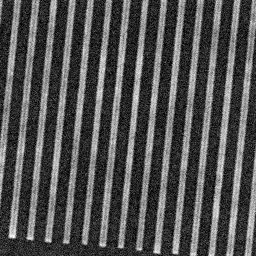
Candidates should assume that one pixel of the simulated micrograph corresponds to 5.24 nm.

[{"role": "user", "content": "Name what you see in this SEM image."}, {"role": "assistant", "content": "parallel lines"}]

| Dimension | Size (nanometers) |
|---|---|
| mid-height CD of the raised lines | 28.7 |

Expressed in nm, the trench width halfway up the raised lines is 64.5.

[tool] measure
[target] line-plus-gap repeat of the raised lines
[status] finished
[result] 0.0954 micrometres